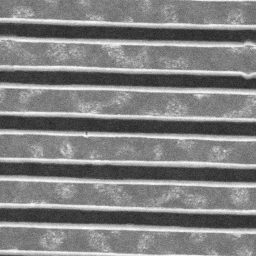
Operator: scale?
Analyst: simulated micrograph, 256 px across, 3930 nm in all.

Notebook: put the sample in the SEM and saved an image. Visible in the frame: parallel lines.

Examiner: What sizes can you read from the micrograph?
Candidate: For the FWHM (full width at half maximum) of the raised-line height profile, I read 0.445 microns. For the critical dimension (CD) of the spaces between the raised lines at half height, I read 257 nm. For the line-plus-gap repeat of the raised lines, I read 711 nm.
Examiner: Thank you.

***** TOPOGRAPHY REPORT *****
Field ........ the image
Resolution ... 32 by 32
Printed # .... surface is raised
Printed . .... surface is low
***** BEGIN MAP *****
################################
################################
################################
................................
................................
##########################....##
################################
################################
##.#############################
...............................#
................................
################################
################################
################################
...........#####################
................................
##..............................
################################
################################
################################
...................###.#########
................................
########........................
################################
################################
################################
..........................#...##
................................
##################..............
################################
################################
################################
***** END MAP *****